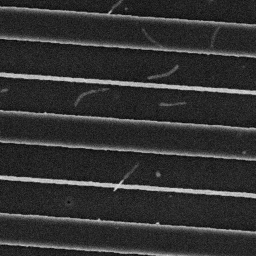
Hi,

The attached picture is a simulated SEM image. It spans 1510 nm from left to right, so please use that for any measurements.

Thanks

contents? lines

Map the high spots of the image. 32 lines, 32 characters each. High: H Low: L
LLLLLLLLLLLLLLLLLLLLLLLLLLLLLLLL
HHHHHHHHHHLLLLLLLLLLLLLLLLLLLLLL
HHHHHHHHHHHHHHHHHHHHHHHHLLLLLLLL
HHHHHHHHHHHHHHHHHHHHHHHHHHHHHHHH
HHHHHHHHHHHHHHHHHHHHHHHHHHHHHHHH
LLLLLLLLLHHHHHHHHHHHHHHHHHHHHHHH
LLLLLLLLLLLLLLLLLLLLLLLHHHHHHHHH
LLLLLLLLLLLLLLLLLLLLLLLLLLLLLLLL
LLLLLLLLLLLLLLLLLLLLLLLLLLLLLLLL
LLLLLLLLLLLLLLLLLLLLLLLLLLLLLLLL
LLLLLLLLLLLLLLLLHHLLLLLLLLLLLLLL
LLLLLLLLLLLLLLLLLLLLLLLLLLLLLLLL
LLLLLLLLLLLLLLLLLLLLLLLLLLLLLLLL
LLLLLLLLLLLLLLLLLLLLLLLLLLLLLLLL
HHHHHHHHHHLLLLLLLLLLLLLLLLLLLLLL
HHHHHHHHHHHHHHHHHHHHHHHHHLLLLLLL
HHHHHHHHHHHHHHHHHHHHHHHHHHHHHHHH
HHHHHHHHHHHHHHHHHHHHHHHHHHHHHHHH
LLLLLLLLLLHHHHHHHHHHHHHHHHHHHHHH
LLLLLLLLLLLLLLLLLLLLLLLLLHHHHHHH
LLLLLLLLLLLLLLLLLLLLLLLLLLLLLLLL
LLLLLLLLLLLLLLLLLLLLLLLLLLLLLLLL
LHLLLLLLLLLLLLLLLLLLLLLLLLLLLLLL
LLLLLLLLLLLLLLHLLLHHLLLLLLLLLLLL
LLLLLLLLLLLLLLLLLLLLLLLLLLLLLHHL
LLLLLLLLLLLLLLLLLLLLLLLLLLLLLLLL
LLLLLLLLLLLLLLLLLLLLLLLLLLLLLLLL
HHHHHHHHHHHHLLLLLLLLLLLLLLLLLLLL
HHHHHHHHHHHHHHHHHHHHHHHHHLLLLLLL
HHHHHHHHHHHHHHHHHHHHHHHHHHHHHHHH
LHHHHHHHHHHHHHHHHHHHHHHHHHHHHHHH
LLLLLLLLLLLLLLHHHHHHHHHHHHHHHHHH